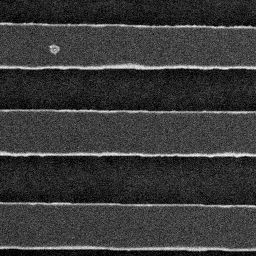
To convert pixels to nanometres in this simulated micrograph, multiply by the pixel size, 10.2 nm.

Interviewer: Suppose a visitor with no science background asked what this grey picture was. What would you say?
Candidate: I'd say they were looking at lines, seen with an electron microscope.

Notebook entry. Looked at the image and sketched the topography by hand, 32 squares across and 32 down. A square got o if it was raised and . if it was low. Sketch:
................................
................................
................................
oooooooooooooooooooooooooooooooo
oooooooooooooooooooooooooooooooo
oooooooooooooooooooooooooooooooo
oooooooooooooooooooooooooooooooo
oooooooooooooooooooooooooooooooo
...ooo....o.o....ooo......ooo..o
................................
................................
................................
................................
................................
oooooooooooooooooooooooooooooooo
oooooooooooooooooooooooooooooooo
oooooooooooooooooooooooooooooooo
oooooooooooooooooooooooooooooooo
oooooooooooooooooooooooooooooooo
..........................o.....
................................
................................
................................
................................
................................
ooooooooo.......................
oooooooooooooooooooooooooooooooo
oooooooooooooooooooooooooooooooo
oooooooooooooooooooooooooooooooo
oooooooooooooooooooooooooooooooo
oooooooooooooooooooooooooooooooo
................................